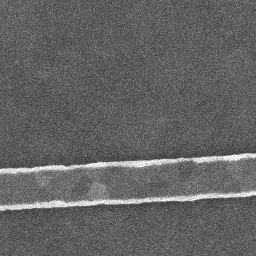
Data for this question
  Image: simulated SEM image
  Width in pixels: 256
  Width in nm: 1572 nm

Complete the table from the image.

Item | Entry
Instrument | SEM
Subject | one or a few lines or trenches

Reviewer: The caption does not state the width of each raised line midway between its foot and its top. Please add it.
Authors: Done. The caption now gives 244 nanometers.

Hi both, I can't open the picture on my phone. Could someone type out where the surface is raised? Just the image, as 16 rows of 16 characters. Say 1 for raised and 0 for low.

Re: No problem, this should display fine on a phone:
0000000000000000
0000000000000000
0000000000000000
0000000000000000
0000000000000000
0000000000000000
0000000000000000
0000000000000000
0000000000000000
0000000000000000
0001111111111111
1111111111111111
1111111111100000
0000000000000000
0000000000000000
0000000000000000